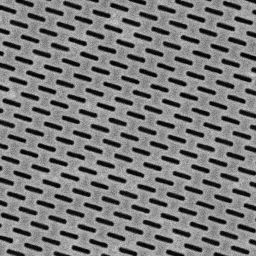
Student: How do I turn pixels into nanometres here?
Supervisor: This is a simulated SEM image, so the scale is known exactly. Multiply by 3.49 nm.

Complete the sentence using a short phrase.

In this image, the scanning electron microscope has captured a regular array of holes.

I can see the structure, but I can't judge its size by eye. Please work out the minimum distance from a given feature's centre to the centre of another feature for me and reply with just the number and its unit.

0.0645 µm